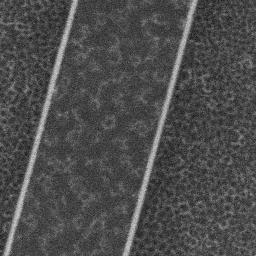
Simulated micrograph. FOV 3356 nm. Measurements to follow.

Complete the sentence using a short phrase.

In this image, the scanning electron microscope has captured one or a few lines or trenches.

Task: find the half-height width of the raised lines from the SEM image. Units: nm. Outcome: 1510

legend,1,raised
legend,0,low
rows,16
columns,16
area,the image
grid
0000011111110000
0000111111110000
0000111111110000
0000111111100000
0000111111100000
0001111111100000
0001111111000000
0001111111000000
0011111111000000
0011111111000000
0011111110000000
0011111110000000
0111111110000000
0111111110000000
0111111100000000
0111111100000000